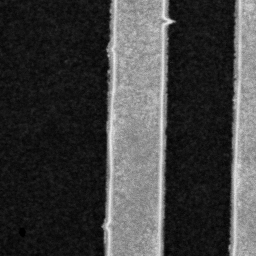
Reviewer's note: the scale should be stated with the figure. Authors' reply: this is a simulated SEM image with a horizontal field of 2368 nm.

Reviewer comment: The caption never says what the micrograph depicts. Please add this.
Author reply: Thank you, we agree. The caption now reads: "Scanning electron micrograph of one or a few lines or trenches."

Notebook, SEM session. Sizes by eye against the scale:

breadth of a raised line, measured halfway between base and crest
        458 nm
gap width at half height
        698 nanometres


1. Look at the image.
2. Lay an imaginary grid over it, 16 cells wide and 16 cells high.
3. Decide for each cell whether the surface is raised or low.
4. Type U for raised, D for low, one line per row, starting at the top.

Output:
DDDDDDDUUUDDDDDU
DDDDDDDUUUDDDDDU
DDDDDDDUUUDDDDDU
DDDDDDDUUUDDDDDU
DDDDDDDUUUDDDDDU
DDDDDDDUUUDDDDDU
DDDDDDDUUUDDDDDU
DDDDDDDUUUDDDDDU
DDDDDDDUUUDDDDDU
DDDDDDDUUUDDDDDU
DDDDDDDUUUDDDDDU
DDDDDDDUUUDDDDDU
DDDDDDDUUUDDDDDU
DDDDDDDUUUDDDDDU
DDDDDDDUUUDDDDDU
DDDDDDDUUUDDDDDU